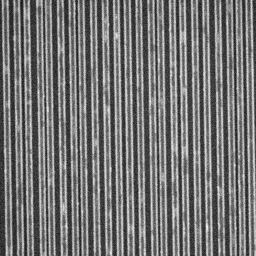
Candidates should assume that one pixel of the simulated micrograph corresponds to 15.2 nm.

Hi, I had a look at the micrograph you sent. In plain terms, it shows parallel lines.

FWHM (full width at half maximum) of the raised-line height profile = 81.5 nm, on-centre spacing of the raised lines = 168 nm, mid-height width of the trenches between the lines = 0.0891 microns